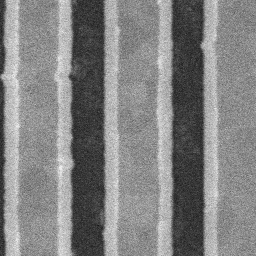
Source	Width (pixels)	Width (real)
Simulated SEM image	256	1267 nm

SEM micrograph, one or a few lines or trenches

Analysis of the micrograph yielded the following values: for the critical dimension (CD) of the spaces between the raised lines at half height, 0.232 um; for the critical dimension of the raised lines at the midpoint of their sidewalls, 0.262 µm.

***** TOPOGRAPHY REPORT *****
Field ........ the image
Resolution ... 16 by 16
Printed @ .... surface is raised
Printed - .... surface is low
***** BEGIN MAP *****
-@@@---@@@---@@@
-@@@---@@@---@@@
-@@@---@@@---@@@
-@@@---@@@---@@@
-@@@---@@@---@@@
-@@@---@@@---@@@
-@@@---@@@---@@@
-@@@---@@@---@@@
-@@@---@@@---@@@
-@@@---@@@---@@@
-@@@---@@@---@@@
-@@@---@@@---@@@
-@@@---@@@---@@@
-@@@---@@@---@@@
-@@@---@@@---@@@
-@@@---@@@---@@@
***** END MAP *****